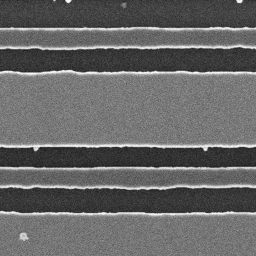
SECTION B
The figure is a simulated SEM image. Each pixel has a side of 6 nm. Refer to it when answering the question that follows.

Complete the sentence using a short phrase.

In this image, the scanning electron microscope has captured lines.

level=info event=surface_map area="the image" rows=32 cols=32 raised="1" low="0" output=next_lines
00000000000000000000000000000000
00000000000000000000000000000000
00000000000000000000000000000000
01000000001000011111000000111010
11111111111111111111111111111111
11111111111111111111111111111111
00000000000000000000000000000000
00000000000000000000000000000000
00000000000000000000000000000000
11111111111111111111111111111111
11111111111111111111111111111111
11111111111111111111111111111111
11111111111111111111111111111111
11111111111111111111111111111111
11111111111111111111111111111111
11111111111111111111111111111111
11111111111111111111111111111111
11111111111111111111111111111111
00000000000000000000000000000000
00000000000000000000000000000000
00000000000000000000000000000000
11111111111111111111111111111111
11111111111111111111111111111111
00010000111101011111100000000000
00000000000000000000000000000000
00000000000000000000000000000000
10000000000000000000000000000000
11111111111111111111111111111111
11111111111111111111111111111111
11111111111111111111111111111111
11111111111111111111111111111111
11111111111111111111111111111111